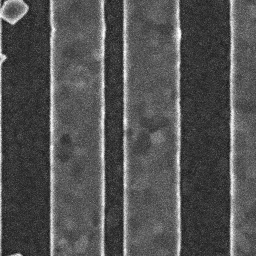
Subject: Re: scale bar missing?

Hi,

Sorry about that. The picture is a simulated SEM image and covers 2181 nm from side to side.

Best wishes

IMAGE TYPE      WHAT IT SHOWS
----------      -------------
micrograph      one or a few lines or trenches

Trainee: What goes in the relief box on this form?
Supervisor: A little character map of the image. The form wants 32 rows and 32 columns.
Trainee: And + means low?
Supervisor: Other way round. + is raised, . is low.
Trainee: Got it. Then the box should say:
.++...+++++++...++++++.......+++
+++...+++++++...++++++.......+++
.+....+++++++...++++++.......+++
.......++++++...++++++.......+++
......+++++++...+++++++......+++
......+++++++...++++++.......+++
......+++++++...++++++.......+++
......+++++++...++++++.......+++
......+++++++...++++++.......+++
......+++++++...++++++.......+++
......+++++++...++++++.......+++
......+++++++...++++++.......+++
......+++++++...++++++.......+++
......+++++++...++++++.......+++
......+++++++...++++++.......+++
......+++++++...++++++.......+++
......+++++++...++++++.......+++
......+++++++...++++++.......+++
......+++++++...++++++.......+++
......+++++++...++++++.......+++
......+++++++...++++++.......+++
......+++++++...++++++.......+++
......+++++++...++++++.......+++
......+++++++...++++++.......+++
......+++++++...++++++.......+++
......+++++++...++++++.......+++
......+++++++...++++++.......+++
......+++++++...++++++.......+++
......+++++++...++++++.......+++
......+++++++...++++++.......+++
......+++++++...++++++.......+++
......+++++++...++++++.......+++